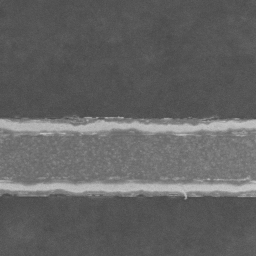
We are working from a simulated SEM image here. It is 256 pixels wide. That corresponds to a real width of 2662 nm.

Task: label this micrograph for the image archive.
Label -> one or a few lines or trenches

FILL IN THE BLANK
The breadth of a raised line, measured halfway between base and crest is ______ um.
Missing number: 0.633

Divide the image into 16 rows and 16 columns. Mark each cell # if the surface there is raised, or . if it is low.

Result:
................
................
................
................
................
................
................
................
################
################
################
################
................
................
................
................